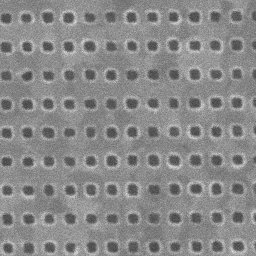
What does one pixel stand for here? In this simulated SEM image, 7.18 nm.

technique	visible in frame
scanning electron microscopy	a regular array of holes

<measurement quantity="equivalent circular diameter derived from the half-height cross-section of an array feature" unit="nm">89.4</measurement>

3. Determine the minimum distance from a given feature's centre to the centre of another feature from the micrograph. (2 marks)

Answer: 149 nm